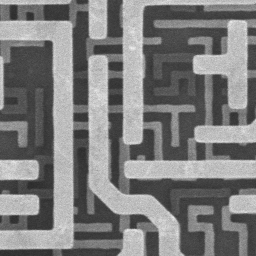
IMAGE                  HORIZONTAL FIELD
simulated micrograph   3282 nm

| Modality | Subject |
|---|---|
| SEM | wiring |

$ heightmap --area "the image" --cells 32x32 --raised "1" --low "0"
00000000000110011111111111000000
00000000000110011100000000000000
00000000000110011100000000000000
11111111100110011100000000000110
11111111100110011100000000000110
00000001100000011100000000000110
00000001100000011100000000001110
00000001100110011100000011111110
00000001100110011100000011111110
00000001100110011100000000001110
00000001100110011100000000000110
00000001100110011100000000000110
00000001100110011100000000000110
00000001100110011100000000000100
00000001100110011100000000000000
00000001100110011100000000000001
00000001100110011100000011111111
00000001100110011100000001111111
00000001100110000000000000000000
00000001100110000000000000000000
11111001100110001111111111111111
11111001100110001111111111111111
00000001100111000000000000000000
00000001100111100000000000000000
11111001100011111110000000000111
11111001100001111111000000000111
11111001100000111111100000000110
00000001100000000001110000000000
00000001100000000000110000000000
11111111100000011100110000000000
11111111100000011100110000000000
00000000000000011100111000000000